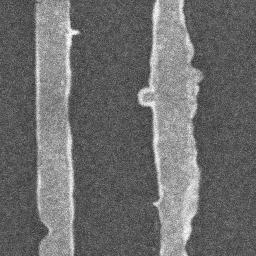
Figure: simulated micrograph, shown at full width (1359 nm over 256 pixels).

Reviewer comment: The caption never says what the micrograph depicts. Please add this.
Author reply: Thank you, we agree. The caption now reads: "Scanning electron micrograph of one or a few lines or trenches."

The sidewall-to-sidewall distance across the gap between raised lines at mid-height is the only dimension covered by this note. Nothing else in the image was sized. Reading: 458 nm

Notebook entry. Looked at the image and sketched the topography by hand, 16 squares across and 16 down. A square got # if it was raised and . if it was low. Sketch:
..##......#.....
..##......##....
..##......##....
..##......##....
..##......##....
..##.....###....
..##.....###....
..##......##....
..##......##....
..##......##....
..##......##....
..##......##....
..##......##....
...##.....##....
...##.....##....
...##.....##....